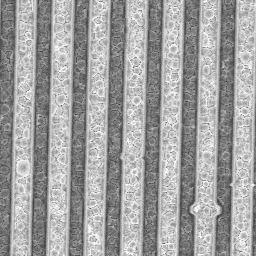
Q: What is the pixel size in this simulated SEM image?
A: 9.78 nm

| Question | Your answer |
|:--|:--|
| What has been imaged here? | parallel lines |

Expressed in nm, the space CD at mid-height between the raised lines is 164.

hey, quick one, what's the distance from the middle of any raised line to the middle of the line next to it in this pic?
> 359 nm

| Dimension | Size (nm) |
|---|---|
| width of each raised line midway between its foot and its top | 193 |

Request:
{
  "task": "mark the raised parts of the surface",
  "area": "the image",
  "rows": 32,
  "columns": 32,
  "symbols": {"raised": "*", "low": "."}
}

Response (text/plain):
..**...**..***..**...**..**...**
..**...**..***..**...**..**...**
..**...**..***..**...**..**...**
..**...**..***..**..***..**...**
..**...**..***..**..***..**...**
..**...**..***..**..***..**...**
..**..***..***..**..***..**...**
..**..***..***..**..***..**..***
..**..***..**...**..***..**..***
..**..***..**...**..***..**..***
..**..***..**...**..***..**..***
..**..***..**...**..***..**..***
..**..***..**...**..***..**..***
..**..***..**...**..***..**..***
..**..***..**...**..***..**..***
..**..***..**...**..***..**..***
..**..***..**..***..***..**..***
..**..***..**..***..***..**..***
..**..***..**..***..**...**..***
..**..***..**..***..**...**..***
..**..***..**..***..**...**..***
..**..***..**..***..**...**..***
..**..***..**..***..**...**..**.
..**..***..**..***..**...**..***
..**..***..**..***..**...**..**.
..**..***..**..***..**..***..***
..**..**...**..***..**..***..***
.***..**...**..***..**..***..**.
..**..**...**..***..**..***..**.
.***..**...**..***..**..***..**.
.***..**...**..***..**..***..**.
.***..**...**..***..**..***..**.